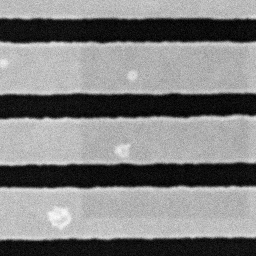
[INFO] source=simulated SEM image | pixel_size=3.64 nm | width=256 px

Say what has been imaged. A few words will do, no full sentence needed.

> lines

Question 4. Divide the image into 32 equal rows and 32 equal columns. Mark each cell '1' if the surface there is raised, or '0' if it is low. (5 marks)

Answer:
11111111111111111111111111111111
11111111111111111111111111111111
00000000000000000000000000000000
00000000000000000000000000000000
00000000000000000000000000000000
11011111111111111111111111111111
11111111111111111111111111111111
11111111111111111111111111111111
11111111111111111111111111111111
11111111111111111111111111111111
11111111111111111111111111111111
11111111111111111111111111111111
00000000000000000000000000000000
00000000000000000000000000000000
00000000000000000000000000000110
11111111111111111111111111111111
11111111111111111111111111111111
11111111111111111111111111111111
11111111111111111111111111111111
11111111111111111111111111111111
11111111100001000110000000000000
00000000000000000000000000000000
00000000000000000000000000000000
00000000100011110110011111111111
11111111111111111111111111111111
11111111111111111111111111111111
11111111111111111111111111111111
11111111111111111111111111111111
11111111111111111111111111111111
11111111111111111111111111111111
00000000000000000000000000000000
00000000000000000000000000000000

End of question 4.